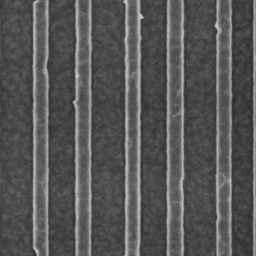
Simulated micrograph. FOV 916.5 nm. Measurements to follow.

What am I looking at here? parallel lines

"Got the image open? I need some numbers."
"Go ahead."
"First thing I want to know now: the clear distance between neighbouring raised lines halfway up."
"101 nanometres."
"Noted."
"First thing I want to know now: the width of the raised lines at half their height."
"50.6 nm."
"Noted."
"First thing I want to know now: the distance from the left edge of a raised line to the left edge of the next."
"164 nanometers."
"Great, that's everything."